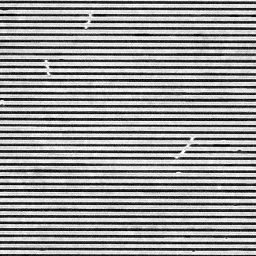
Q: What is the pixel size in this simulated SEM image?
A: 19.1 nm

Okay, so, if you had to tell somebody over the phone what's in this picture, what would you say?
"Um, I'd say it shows parallel lines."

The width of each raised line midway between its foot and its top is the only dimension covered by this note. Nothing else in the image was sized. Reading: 0.0574 microns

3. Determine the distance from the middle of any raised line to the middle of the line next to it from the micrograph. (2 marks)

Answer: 0.124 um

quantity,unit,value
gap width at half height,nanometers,57.4